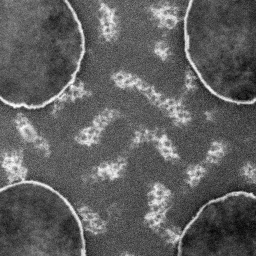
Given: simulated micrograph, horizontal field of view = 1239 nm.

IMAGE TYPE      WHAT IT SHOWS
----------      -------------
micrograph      raised bodies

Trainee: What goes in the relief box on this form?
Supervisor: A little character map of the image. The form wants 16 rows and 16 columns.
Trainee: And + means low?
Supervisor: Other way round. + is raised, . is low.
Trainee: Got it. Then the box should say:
++++........++++
+++++.......++++
+++++.......++++
+++++.......++++
+++++.......++++
++++.........+++
.++.............
................
................
................
................
.+..............
++++.........+++
+++++.......++++
+++++......+++++
+++++......+++++